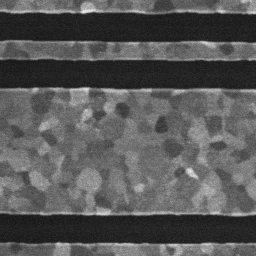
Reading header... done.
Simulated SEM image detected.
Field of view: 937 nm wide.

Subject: lines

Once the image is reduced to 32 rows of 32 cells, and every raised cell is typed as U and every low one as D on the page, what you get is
UUUUUUUUUUUUUUUUUUUUUUUUUUUUUUUU
UUUUUUUUUUUUUUUUUUUUUUUDUUUUUUUU
DDDDDDDDDDDDDDDDDDDDDDDDDDDDDDDD
DDDDDDDDDDDDDDDDDDDDDDDDDDDDDDDD
DDDDDDDDDDDDDDDDDDDDDDDDDDDDDDDD
UUUUUUUUUUUUUUUUUUUUUUUUUUUUUUUU
UUUUUUUUUUUUUUUUUUUUUUUUUUUUUUUU
DDDDDDDDDUDUDDUDDDDDDUUUUUUUUUDD
DDDDDDDDDDDDDDDDDDDDDDDDDDDDDDDD
DDDDDDDDDDDDDDDDDDDDDDDDDDDDDDDD
DDDDDDDDDDDDDDDDDDDDDDDDDDDDDDDD
UUUUUUUUUUUUUUUUUUUUUUUUUUUUUUUU
UUUUUUUUUUUUUUUUUUUUUUUUUUUUUUUU
UUUUUUUUUUUUUUUUUUUUUUUUUUUUUUUU
UUUUUUUUUUUUUUUUUUUUUUUUUUUUUUUU
UUUUUUUUUUUUUUUUUUUUUUUUUUUUUUUU
UUUUUUUUUUUUUUUUUUUUUUUUUUUUUUUU
UUUUUUUUUUUUUUUUUUUUUUUUUUUUUUUU
UUUUUUUUUUUUUUUUUUUUUUUUUUUUUUUU
UUUUUUUUUUUUUUUUUUUUUUUUUUUUUUUU
UUUUUUUUUUUUUUUUUUUUUUUUUUUUUUUU
UUUUUUUUUUUUUUUUUUUUUUUUUUUUUUUU
UUUUUUUUUUUUUUUUUUUUUUUUUUUUUUUU
UUUUUUUUUUUUUUUUUUUUUUUUUUUUUUUU
UUUUUUUUUUUUUUUUUUUUUUUUUUUUUUUU
UUUUUUUUUUUUUUUUUUUUUUUUUUUUUUUU
UUUUUUUUUUUUUUUUUUUUUUUUUUUUUUUU
DDDDDDDDDDDDDDDDDDDDDDDDDDDDDDDD
DDDDDDDDDDDDDDDDDDDDDDDDDDDDDDDD
DDDDDDDDDDDDDDDDDDDDDDDDDDDDDDDD
UUUUDUUUUUUDUUUUUDUDDDDDDUUUUUUU
UUUUUUUUUUUUUUUUUUUUUUUUUUUUUUUU